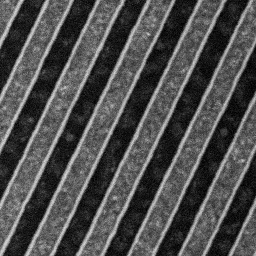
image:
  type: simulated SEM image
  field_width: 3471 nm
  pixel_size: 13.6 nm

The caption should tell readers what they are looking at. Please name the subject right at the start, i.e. parallel lines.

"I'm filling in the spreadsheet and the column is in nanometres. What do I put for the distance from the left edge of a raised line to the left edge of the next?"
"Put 622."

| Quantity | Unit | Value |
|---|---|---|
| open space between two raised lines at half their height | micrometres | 0.308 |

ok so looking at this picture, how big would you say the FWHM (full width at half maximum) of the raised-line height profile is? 23.6 pixels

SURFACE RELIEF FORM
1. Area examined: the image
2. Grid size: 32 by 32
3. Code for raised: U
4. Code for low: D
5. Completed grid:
UUUDDDUUUDDDUUUDDDUUUUDDDUUUDDDU
UUDDDUUUDDDUUUUDDDUUUDDDUUUDDDDU
UUDDDUUUDDDUUUDDDUUUUDDDUUUDDDUU
UDDDUUUDDDDUUUDDDUUUDDDUUUDDDDUU
UDDDUUUDDDUUUDDDUUUUDDDUUUDDDUUU
DDDUUUDDDDUUUDDDUUUDDDUUUDDDDUUU
DDDUUUDDDUUUDDDUUUUDDDUUUDDDUUUD
DDUUUDDDDUUUDDDUUUDDDUUUUDDDUUUD
DDUUUDDDUUUDDDDUUUDDDUUUDDDUUUDD
DUUUUDDDUUUDDDUUUDDDUUUUDDDUUUDD
DUUUDDDUUUDDDDUUUDDDUUUDDDUUUDDD
UUUUDDDUUUDDDUUUDDDUUUUDDDUUUDDD
UUUDDDUUUDDDUUUUDDDUUUDDDUUUUDDD
UUUDDDUUUDDDUUUDDDUUUUDDDUUUDDDU
UUDDDUUUDDDDUUUDDDUUUDDDUUUUDDDU
UUDDDUUUDDDUUUDDDDUUUDDDUUUDDDUU
UDDDUUUUDDDUUUDDDUUUDDDUUUUDDDUU
UDDDUUUDDDUUUDDDDUUUDDDUUUDDDUUU
DDDUUUUDDDUUUDDDUUUDDDUUUUDDDUUU
DDDUUUDDDUUUDDDDUUUDDDUUUDDDUUUD
DDUUUUDDDUUUDDDUUUDDDDUUUDDDUUUD
DDUUUDDDUUUUDDDUUUDDDUUUDDDUUUUD
DUUUUDDDUUUDDDUUUDDDUUUUDDDUUUDD
DUUUDDDUUUUDDDUUUDDDUUUDDDUUUUDD
UUUUDDDUUUDDDUUUDDDDUUUDDDUUUDDD
UUUDDDUUUUDDDUUUDDDUUUDDDUUUUDDD
UUUDDDUUUDDDUUUDDDDUUUDDDUUUDDDU
UUDDDUUUUDDDUUUDDDUUUDDDUUUUDDDU
UUDDDUUUDDDUUUUDDDUUUDDDUUUDDDUU
UDDDUUUUDDDUUUDDDUUUDDDDUUUDDDUU
UDDDUUUDDDUUUUDDDUUUDDDUUUDDDUUU
DDDUUUUDDDUUUDDDUUUDDDDUUUDDDUUU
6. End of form